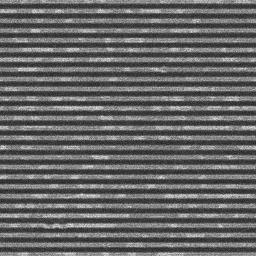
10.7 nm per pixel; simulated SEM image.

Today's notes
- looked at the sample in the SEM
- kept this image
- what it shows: parallel lines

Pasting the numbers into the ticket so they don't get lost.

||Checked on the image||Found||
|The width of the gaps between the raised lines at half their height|62.9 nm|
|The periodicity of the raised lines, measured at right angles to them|104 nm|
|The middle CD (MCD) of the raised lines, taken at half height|42.8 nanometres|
